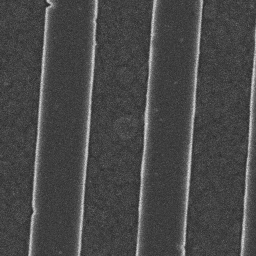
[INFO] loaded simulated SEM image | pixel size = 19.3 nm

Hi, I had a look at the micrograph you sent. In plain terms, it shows one or a few lines or trenches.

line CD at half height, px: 47.8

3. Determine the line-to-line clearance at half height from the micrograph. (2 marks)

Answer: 1100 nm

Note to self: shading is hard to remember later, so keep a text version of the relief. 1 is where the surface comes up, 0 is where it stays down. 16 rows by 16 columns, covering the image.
0001110000111000
0001110000110000
0001110001110000
0001110001110000
0001110001110000
0001110001110000
0001110001110000
0011110001110000
0011110001110000
0011100001110000
0011100001110001
0011100001110001
0011100001110001
0011100001110001
0011100001110001
0011100001100001